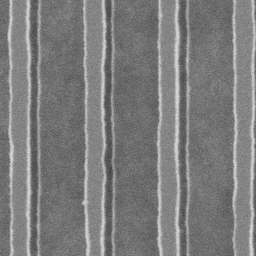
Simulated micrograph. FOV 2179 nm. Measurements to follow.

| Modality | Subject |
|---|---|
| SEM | lines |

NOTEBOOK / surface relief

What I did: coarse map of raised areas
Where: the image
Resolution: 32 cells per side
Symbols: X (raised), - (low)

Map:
-XXX-------XX-------XX-------XXX
-XXX------XXX-------XX-------XXX
-XXX-------XX-------XX-------XXX
-XXX-------XX-------XX-------XXX
-XX--------XX-------XX-------XXX
-XXX-------XX-------XX-------XXX
-XXX-------XX-------XX-------XXX
-XXX-------XX-------XX-------XXX
-XXX-------XX-------XX-------XXX
-XXX-------XX-------XX-------XXX
-XXX-------XX-------XX-------XXX
-XXX-------XX-------XX-------XXX
-XXX-------XX-------XX-------XXX
-XXX-------XX-------XX-------XXX
-XXX-------XX-------XX-------XXX
-XXX-------XX-------XX-------XXX
-XXX-------XX-------XX-------XX-
-XXX-------XX-------XX-------XXX
-XXX-------XX-------XX-------XXX
-XXX-------XX-------XX-------XXX
-XXX-------XX-------XX-------XXX
-XXX-------XX-------XX-------XXX
-XXX-------XX-------XX-------XXX
-XXX-------XX-------XX-------XX-
-XXX-------XX-------XX-------XX-
-XXX------XXX-------XX-------XX-
-XXX-------XX-------XX-------XXX
-XXX-------XX-------XX-------XXX
-XXX-------XX-------XX-------XX-
-XXX-------XX-------XX-------XX-
-XXX-------XX-------XX-------XX-
-XXX-------XX-------XX-------XX-